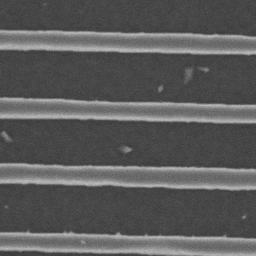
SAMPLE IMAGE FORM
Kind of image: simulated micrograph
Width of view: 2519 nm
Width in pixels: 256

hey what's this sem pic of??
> lines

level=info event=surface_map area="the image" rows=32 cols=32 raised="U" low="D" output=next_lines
DDDDDDDDDDDDDDDDDDDDDDDDDDDDDDDD
DDDDDDDDDDDDDDDDDDDDDDDDDDDDDDDD
DDDDDDDDDDDDDDDDDDDDDDDDDDDDDDDD
DDDDDDDDDDDDDDDDDDDDDDDDDDDDDDDD
UUUUUUUUUUUUUUUUUUUUUUUUUUUUUUUD
UUUUUUUUUUUUUUUUUUUUUUUUUUUUUUUU
DDDDDDDDDDDDDDDDDDDDUUUUUUUUUUUU
DDDDDDDDDDDDDDDDDDDDDDDDDDDDDDDD
DDDDDDDDDDDDDDDDDDDDDDDDDDDDDDDD
DDDDDDDDDDDDDDDDDDDDDDDDDDDDDDDD
DDDDDDDDDDDDDDDDDDDDDDDDDDDDDDDD
DDDDDDDDDDDDDDDDDDDDDDDDDDDDDDDD
UUUUUUUUDDDDDDDDDDDDDDDDDDDDDDDD
UUUUUUUUUUUUUUUUUUUUUUUUUUUUUUUU
UUUUUUUUUUUUUUUUUUUUUUUUUUUUUUUU
DDDDDDDDDDDDDDDDDDDDDDDDDDDDDDDD
DDDDDDDDDDDDDDDDDDDDDDDDDDDDDDDD
DDDDDDDDDDDDDDDDDDDDDDDDDDDDDDDD
DDDDDDDDDDDDDDDDDDDDDDDDDDDDDDDD
DDDDDDDDDDDDDDDDDDDDDDDDDDDDDDDD
UUUUDDDDDDDDDDDDDDDDDDDDDDDDDDDD
UUUUUUUUUUUUUUUUUUUUUUUUUUUUUUUU
UUUUUUUUUUUUUUUUUUUUUUUUUUUUUUUU
DDDDDDDDDDDDDDDDDDDDDUUUUUUUUUUU
DDDDDDDDDDDDDDDDDDDDDDDDDDDDDDDD
DDDDDDDDDDDDDDDDDDDDDDDDDDDDDDDD
DDDDDDDDDDDDDDDDDDDDDDDDDDDDDDDD
DDDDDDDDDDDDDDDDDDDDDDDDDDDDDDDD
DDDDDDDDDDDDDDDDDDDDDDDDDDDDDDDD
UUUUUUUUUUUUUUUUDDDDDDDDDDDDDDDD
UUUUUUUUUUUUUUUUUUUUUUUUUUUUUUUU
DDDDDDUUUUUUUUUUUUUUUUUUUUUUUUUU